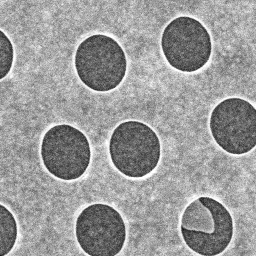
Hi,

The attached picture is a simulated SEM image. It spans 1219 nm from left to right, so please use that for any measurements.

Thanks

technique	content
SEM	holes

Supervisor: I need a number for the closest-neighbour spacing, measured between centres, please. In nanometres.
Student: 373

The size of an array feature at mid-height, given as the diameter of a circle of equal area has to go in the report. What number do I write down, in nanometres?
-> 255